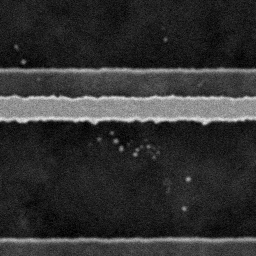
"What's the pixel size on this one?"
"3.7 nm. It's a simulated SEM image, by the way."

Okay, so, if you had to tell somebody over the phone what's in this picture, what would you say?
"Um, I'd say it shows lines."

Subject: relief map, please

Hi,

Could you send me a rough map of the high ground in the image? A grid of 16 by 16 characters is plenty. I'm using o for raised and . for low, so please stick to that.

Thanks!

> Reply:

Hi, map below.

................
................
................
................
oooooooooooooooo
oooooooooooooooo
oooooooooooooooo
.o...o..ooo.oo..
................
................
................
................
................
................
................
oooooooooooooooo